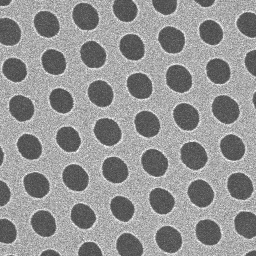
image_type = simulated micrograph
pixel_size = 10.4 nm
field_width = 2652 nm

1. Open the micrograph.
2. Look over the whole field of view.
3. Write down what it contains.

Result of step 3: a regular array of holes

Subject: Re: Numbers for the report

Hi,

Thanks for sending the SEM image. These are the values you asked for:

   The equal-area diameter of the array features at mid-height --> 274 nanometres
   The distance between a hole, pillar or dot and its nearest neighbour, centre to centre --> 404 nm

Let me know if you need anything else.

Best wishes